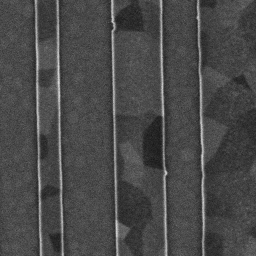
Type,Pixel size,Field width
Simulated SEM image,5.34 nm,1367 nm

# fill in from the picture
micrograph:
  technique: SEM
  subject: one or a few lines or trenches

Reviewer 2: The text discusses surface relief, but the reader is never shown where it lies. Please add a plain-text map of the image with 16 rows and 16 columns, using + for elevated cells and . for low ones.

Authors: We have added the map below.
..++...+++..++++
..++...+++..++++
..++...+++..++++
..++...+++..++++
..++...+++..++++
..++...+++...+++
..++...+++...+++
..++...+++...+++
..++...+++...+++
..++...+++...+++
..++...+++...+++
..++...+++...+++
..++...+++...+++
...+...+++...+++
...+...+++...+++
...+...+++...+++